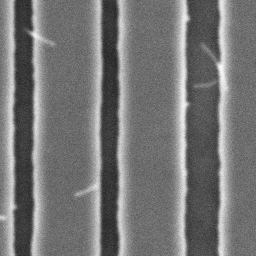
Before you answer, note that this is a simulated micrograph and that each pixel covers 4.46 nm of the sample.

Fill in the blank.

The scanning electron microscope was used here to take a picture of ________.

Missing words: lines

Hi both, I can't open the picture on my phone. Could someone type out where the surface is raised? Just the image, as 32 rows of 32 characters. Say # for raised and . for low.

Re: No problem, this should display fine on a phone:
##..#########..########.....####
##..#########..########.....####
##..########...########.....####
##..########...########.....####
##..#########..########.....####
##..#########..########.....####
##..#########..########.....####
##..#########..########.....####
##..#########..########....#####
##..#########..########.....####
##..#########..########.....####
##..#########..########.....####
##..#########..########.....####
##..########...########.....####
##..########...########.....####
##..########...########.....####
##..########...########.....####
##..########...########....#####
##..########...########....#####
##..########...########.....####
##..########...########.....####
##..########...########.....####
##..########...########.....####
##..########...########.....####
##..########...########.....####
##..########...########.....####
##..########...########.....####
##..########...########....#####
##..########...########....#####
##..########...########....#####
##..########...########....#####
##..########...########....#####